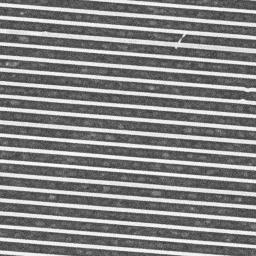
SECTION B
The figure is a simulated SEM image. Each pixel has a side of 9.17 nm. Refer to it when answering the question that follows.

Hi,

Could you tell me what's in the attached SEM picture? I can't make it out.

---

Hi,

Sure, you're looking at parallel lines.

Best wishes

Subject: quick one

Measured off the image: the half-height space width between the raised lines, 0.0857 um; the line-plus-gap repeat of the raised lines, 119 nanometres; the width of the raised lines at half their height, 30.8 nm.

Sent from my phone